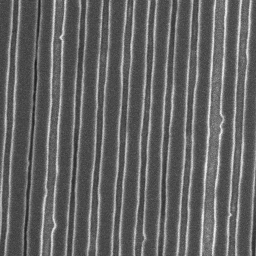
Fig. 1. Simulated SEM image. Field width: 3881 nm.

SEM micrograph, parallel lines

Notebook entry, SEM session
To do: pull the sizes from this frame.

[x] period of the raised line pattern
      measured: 346 nanometers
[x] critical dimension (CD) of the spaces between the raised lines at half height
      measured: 104 nm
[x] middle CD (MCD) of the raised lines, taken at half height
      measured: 244 nm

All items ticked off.